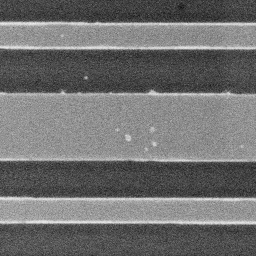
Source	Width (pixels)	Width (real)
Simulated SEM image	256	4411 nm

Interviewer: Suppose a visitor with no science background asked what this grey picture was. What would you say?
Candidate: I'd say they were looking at lines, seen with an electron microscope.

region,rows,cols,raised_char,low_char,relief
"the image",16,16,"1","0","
0000000000000000
1111111111111111
1111111111111111
0000000000000000
0000000000000000
0000000000000000
1111111111111111
1111111111111111
1111111111111111
1111111111111111
0000000000000000
0000000000000000
1111111111111111
1111111111111111
0000000000000000
0000000000000000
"